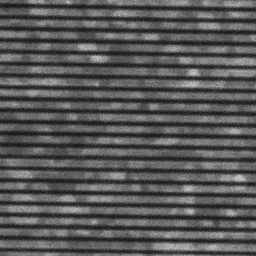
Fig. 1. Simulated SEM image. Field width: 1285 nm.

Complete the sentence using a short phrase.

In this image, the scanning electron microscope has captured parallel lines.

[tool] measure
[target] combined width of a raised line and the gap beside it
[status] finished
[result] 58.2 nm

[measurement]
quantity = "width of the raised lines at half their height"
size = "0.0313 µm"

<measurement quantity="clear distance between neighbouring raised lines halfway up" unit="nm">27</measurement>